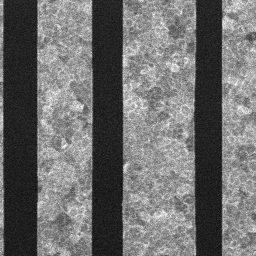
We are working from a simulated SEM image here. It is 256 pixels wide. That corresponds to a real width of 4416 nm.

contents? one or a few lines or trenches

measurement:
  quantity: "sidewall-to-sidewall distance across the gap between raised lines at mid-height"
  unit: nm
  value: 543